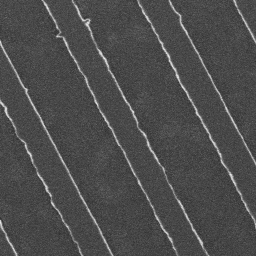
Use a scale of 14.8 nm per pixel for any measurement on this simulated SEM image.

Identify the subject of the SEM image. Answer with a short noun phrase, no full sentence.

one or a few lines or trenches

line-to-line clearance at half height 0.845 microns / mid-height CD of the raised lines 410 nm